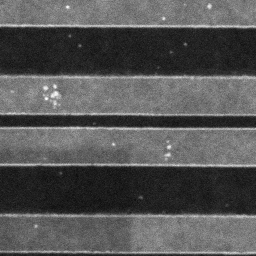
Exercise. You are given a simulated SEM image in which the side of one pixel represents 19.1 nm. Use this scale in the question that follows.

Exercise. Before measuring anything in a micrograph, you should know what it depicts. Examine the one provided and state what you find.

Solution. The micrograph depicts lines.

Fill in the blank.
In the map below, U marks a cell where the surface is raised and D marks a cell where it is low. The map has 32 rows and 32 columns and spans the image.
DDDDDDDDDDDDDDDDDDDDDDDDDDDDDDDD
DDDDDDDDDDDDDDDDDDDDDDDDDDDDDDDD
DDDDDDDDDDDDDDDDDDDDDDDDDDDDDDDD
UUUUUUUUUUUUUUUUUUUUUUUUUUUUUUUU
UUUUUUUUUUUUUUUUUUUUUUUUUUUUUUUU
UUUUUUUUUUUUUUUUUUUUUUUUUUUUUUUU
UUUUUUUUUUUUUUUUUUUUUUUUUUUUUUUU
UUUUUUUUUUUUUUUUUUUUUUUUUUUUUUUU
UUUUUUUUUUUUUUUUUUUUUUUUUUUUUUUU
DDDDUUUUUUUUUUUUUUUUUUUUUUUUUUUU
DDDDDDDDDDDDDDDDDDDDDDDDDDDDDDDD
DDDDDDDDDDDDDDDDDDDDDDDDDDDDDDDD
DDDDDDDDDDDDDDDDDDDDDDDDDDDDDDDD
DDDDDDDDDDDDDDDDDDDDDDDDDDDDDDDD
UUUUUUUUUUUUUUUUUUUUUUUUUUUUUUUU
UUUUUUUUUUUUUUUUUUUUUUUUUUUUUUUU
DDDDDDDDDDDDDDDDDDDDDDDDDDDDDDDD
DDDDDDDDDDDDDDDDDDDDDDDDDDDDDDDD
DDDDDDDDDDDDDDDDDDDDDDDDDDDDDDDD
DDDDDDDDDDDDDDDDDDDDDDDDDDDDDDDD
DDDDDDDDDDDDDDDDDDDDDDDDDDDDDDDD
UUUUUUUUUUUUUUUUUUUUUUUUUUUUUUUU
UUUUUUUUUUUUUUUUUUUUUUUUUUUUUUUU
UUUUUUUUUUUUUUUUUUUUUUUUUUUUUUUU
UUUUUUUUUUUUUUUUUUUUUUUUUUUUUUUU
UUUUUUUUUUUUUUUUUUUUUUUUUUUUUUUU
UUUUUUUUUUUUUUUUUUUUUUUUUUUUUUUU
DDDDDDDDDDDDDDDDDDDDDDDDDDDDDDDD
DDDDDDDDDDDDDDDDDDDDDDDDDDDDDDDD
DDDDDDDDDDDDDDDDDDDDDDDDDDDDDDDD
DDDDDDDDDDDDDDDDDDDDDDDDDDDDDDDD
DDDDDDDDDDDDDDDDDDDDDDDDDDDDDDDD